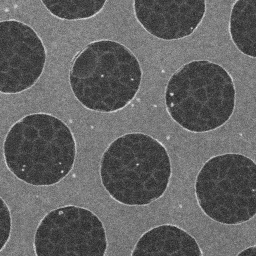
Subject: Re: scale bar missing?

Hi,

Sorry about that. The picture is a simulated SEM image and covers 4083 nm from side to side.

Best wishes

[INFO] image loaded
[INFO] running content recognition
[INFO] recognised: holes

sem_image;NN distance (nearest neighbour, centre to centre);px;93.3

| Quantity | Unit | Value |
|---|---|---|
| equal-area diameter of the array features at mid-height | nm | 1110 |